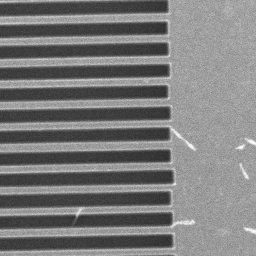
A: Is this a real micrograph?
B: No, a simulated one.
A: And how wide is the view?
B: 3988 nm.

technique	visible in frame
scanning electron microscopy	parallel lines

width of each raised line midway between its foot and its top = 138 nm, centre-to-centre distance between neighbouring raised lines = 0.332 microns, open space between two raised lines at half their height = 0.199 microns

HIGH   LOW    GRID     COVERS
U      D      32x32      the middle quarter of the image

DDDDDDDDDDDDDDDDDDDDDDDDDDUUUUUU
DDDDDDDDDDDDDDDDDDDDDDDDDDUUUUUU
DDDDDDDDDDDDDDDDDDDDDDDDDDUUUUUU
DDDDDDDDDDDDDDDDUUUUUUUUUUUUUUUU
UUUUUUUUUUUUUUUUUUUUUUUUUUUUUUUU
UUUUUUUUUUUUUUDDDDDDDDDDDUUUUUUU
DDDDDDDDDDDDDDDDDDDDDDDDDDUUUUUU
DDDDDDDDDDDDDDDDDDDDDDDDDDUUUUUU
DDDDDDDDDDDDDDDDDDDDDDDDDDUUUUUU
UUUUUUUUUUUUUUUUUUUUUUUUUUUUUUUU
UUUUUUUUUUUUUUUUUUUUUUUUUUUUUUUU
DDDDDDDDDDDDDDDDDDDDDDDDDDDUUUUU
DDDDDDDDDDDDDDDDDDDDDDDDDDDUUUUU
DDDDDDDDDDDDDDDDDDDDDDDDDDUUUUUU
UUUUUUUUUUUUUUUUUUUUUUUUUUUUUUUU
UUUUUUUUUUUUUUUUUUUUUUUUUUUUUUUU
DDDDDDDDDDDDDDDDDDDDDDDDDDUUUUUU
DDDDDDDDDDDDDDDDDDDDDDDDDDUUUUUU
DDDDDDDDDDDDDDDDDDDDDDDDDDUUUUUU
DUUUUUUUDDDDDUUUUUUUUUUUUUUUUUUU
UUUUUUUUUUUUUUUUUUUUUUUUUUUUUUUU
UUUUUUUUUUUUUUUUUUUUUUUUDDUUUUUU
DDDDDDDDDDDDDDDDDDDDDDDDDDDUUUUU
DDDDDDDDDDDDDDDDDDDDDDDDDDDUUUUU
DDDDDDDDDDDDDDDDDDDDDDDDDDUUUUUU
UUUUUUUUUUUUUUUUUUUUUUUUUUUUUUUU
UUUUUUUUUUUUUUUUUUUUUUUUUUUUUUUU
DDDDDDDDDDDDDDDDDDDDDDDDDDDUUUUU
DDDDDDDDDDDDDDDDDDDDDDDDDDDUUUUU
DDDDDDDDDDDDDDDDDDDDDDDDDDDUUUUU
DDDUUUUUUUUUUUUUUUUUUUUUUUUUUUUU
UUUUUUUUUUUUUUUUUUUUUUUUUUUUUUUU